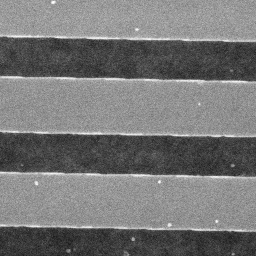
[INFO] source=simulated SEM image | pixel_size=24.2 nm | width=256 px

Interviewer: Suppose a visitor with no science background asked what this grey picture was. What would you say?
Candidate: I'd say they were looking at lines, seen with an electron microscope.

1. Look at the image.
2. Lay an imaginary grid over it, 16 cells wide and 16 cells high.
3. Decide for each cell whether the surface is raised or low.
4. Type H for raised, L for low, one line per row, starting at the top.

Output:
HHHHHHHHHHHHHHHH
HHHHHHHHHHHHHHHH
LLLLLLLLLLLHHHHH
LLLLLLLLLLLLLLLL
LLLLLLLLLLLLLLLL
HHHHHHHHHHHHHHHH
HHHHHHHHHHHHHHHH
HHHHHHHHHHHHHHHH
LLLLLLLLLLLLLHHH
LLLLLLLLLLLLLLLL
LLLLLLLLLLLLLLLL
HHHHHHHHHHHHHHHH
HHHHHHHHHHHHHHHH
HHHHHHHHHHHHHHHH
LLLLLLLLLLLLLLLL
LLLLLLLLLLLLLLLL